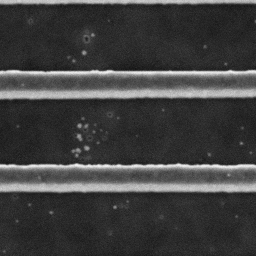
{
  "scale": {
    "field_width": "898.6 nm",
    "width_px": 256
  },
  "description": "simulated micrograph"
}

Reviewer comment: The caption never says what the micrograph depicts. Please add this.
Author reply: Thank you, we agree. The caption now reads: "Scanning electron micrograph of lines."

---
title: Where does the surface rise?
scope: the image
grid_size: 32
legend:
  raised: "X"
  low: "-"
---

--------------------------------
--------------------------------
--------------------------------
--------------------------------
--------------------------------
--------------------------------
--------------------------------
--------------------------------
--------------------------------
XXXXXXXXXXXXXXXXXXXXXXXXXXXXXXXX
XXXXXXXXXXXXXXXXXXXXXXXXXXXXXXXX
XXXXXXXXXXXXXXXXXXXXXXXXXXXXXXXX
--------------------------------
--------------------------------
--------------------------------
--------------------------------
--------------------------------
--------------------------------
--------------------------------
--------------------------------
--------------------------------
XXXXXXXXXXXXXXXXXXXXXXXXXXXXXXXX
XXXXXXXXXXXXXXXXXXXXXXXXXXXXXXXX
X----XXXX-X---X----X---X-XXXXXXX
--------------------------------
--------------------------------
--------------------------------
--------------------------------
--------------------------------
--------------------------------
--------------------------------
--------------------------------